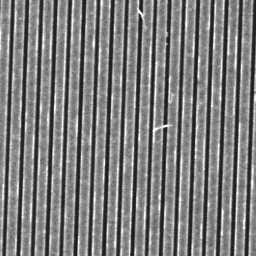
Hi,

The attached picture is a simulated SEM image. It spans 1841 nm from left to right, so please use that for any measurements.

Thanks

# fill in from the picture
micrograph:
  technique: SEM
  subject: parallel lines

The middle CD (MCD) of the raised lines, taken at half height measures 72.7 nm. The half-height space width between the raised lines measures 33.2 nanometres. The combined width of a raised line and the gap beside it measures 102 nm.